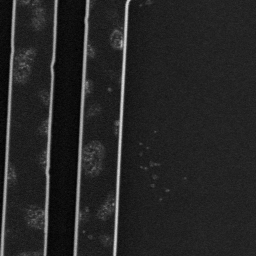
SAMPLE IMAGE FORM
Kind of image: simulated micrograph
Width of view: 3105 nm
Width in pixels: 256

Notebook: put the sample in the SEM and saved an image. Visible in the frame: one or a few lines or trenches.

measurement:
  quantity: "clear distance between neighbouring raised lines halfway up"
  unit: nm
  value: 377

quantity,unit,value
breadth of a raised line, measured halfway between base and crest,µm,0.49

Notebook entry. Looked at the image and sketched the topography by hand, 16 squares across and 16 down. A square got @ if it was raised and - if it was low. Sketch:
-@@--@@@--------
-@@--@@@--------
-@@--@@@--------
-@@--@@@--------
-@@--@@@--------
-@@--@@@--------
-@@--@@@--------
-@@--@@@--------
-@@--@@@--------
@@@--@@---------
@@@--@@---------
@@@--@@---------
@@@--@@---------
@@@--@@---------
@@@--@@---------
@@@--@@---------